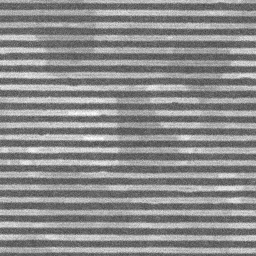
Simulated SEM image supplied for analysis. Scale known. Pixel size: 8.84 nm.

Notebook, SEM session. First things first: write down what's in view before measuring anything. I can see parallel lines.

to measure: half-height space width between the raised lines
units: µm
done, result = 0.0707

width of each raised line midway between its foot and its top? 38.7 nm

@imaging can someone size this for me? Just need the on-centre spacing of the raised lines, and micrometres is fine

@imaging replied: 0.11